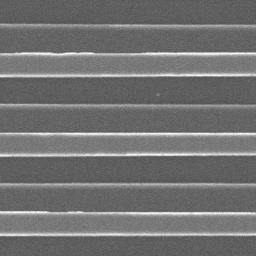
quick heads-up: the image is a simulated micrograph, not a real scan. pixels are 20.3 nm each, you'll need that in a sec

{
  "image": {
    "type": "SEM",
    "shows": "lines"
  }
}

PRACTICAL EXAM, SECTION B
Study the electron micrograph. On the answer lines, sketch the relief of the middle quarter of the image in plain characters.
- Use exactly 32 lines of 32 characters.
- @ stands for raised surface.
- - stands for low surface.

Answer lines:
@@@@@@@@@@@@@@@@@@@@@@@@@@@@@@@@
@@@@@@@@@@@@@@@@@@@@@@@@@@@@@@@@
@@@@@@@@@@@@@@@@@@@@@@@@@@@@@@@@
--------------------------------
--------------------------------
--------------------------------
--------------------------------
--------------------------------
--------------------------------
--------------------------------
--------------------------------
--------------------------------
--------------------------------
--------------------------------
--------------------------------
--------------------------------
--------------------------------
@@@@@@@@@@@@@@@@@@@@@@@@@@@@@@@@
@@@@@@@@@@@@@@@@@@@@@@@@@@@@@@@@
@@@@@@@@@@@@@@@@@@@@@@@@@@@@@@@@
@@@@@@@@@@@@@@@@@@@@@@@@@@@@@@@@
@@@@@@@@@@@@@@@@@@@@@@@@@@@@@@@@
@@@@@@@@@@@@@@@@@@@@@@@@@@@@@@@@
--------------------------------
--------------------------------
--------------------------------
--------------------------------
--------------------------------
--------------------------------
--------------------------------
--------------------------------
--------------------------------